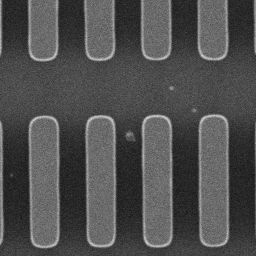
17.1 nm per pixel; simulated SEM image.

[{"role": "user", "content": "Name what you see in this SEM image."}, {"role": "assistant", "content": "groups of lines, slits or small figures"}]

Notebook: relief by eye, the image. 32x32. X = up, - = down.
----XXX----XXX----XXX----XXX----
----XXX----XXX----XXX----XXX----
----XXX----XXX----XXX----XXX----
----XXX----XXX----XXX----XXX----
----XXX----XXX----XXX----XXX----
----XXX----XXX----XXX----XXX----
----XXX----XXX----XXX----XXX----
-----X--------------------------
--------------------------------
--------------------------------
--------------------------------
--------------------------------
--------------------------------
--------------------------------
--------------------------X-----
----XXX----XXX----XXX----XXX----
----XXX----XXX----XXX----XXX----
----XXX----XXX----XXX----XXX----
----XXX----XXX----XXX----XXX----
----XXX----XXX----XXX----XXX----
----XXX----XXX----XXX----XXX----
----XXX----XXX----XXX----XXX----
----XXX----XXX----XXX----XXX----
----XXX----XXX----XXX----XXX----
----XXX----XXX----XXX----XXX----
----XXX----XXX----XXX----XXX----
----XXX----XXX----XXX----XXX----
----XXX----XXX----XXX----XXX----
----XXX----XXX----XXX----XXX----
----XXX----XXX----XXX----XXX----
----XXX----XXX----XXX-----XX----
--------------------------------